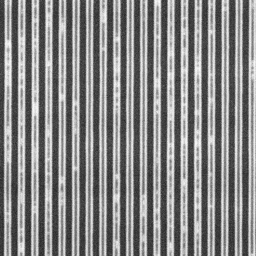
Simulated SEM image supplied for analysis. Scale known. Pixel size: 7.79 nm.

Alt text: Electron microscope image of parallel lines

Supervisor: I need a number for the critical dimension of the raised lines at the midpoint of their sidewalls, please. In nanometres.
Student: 38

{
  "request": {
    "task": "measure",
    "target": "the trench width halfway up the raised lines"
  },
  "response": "67.1 nanometres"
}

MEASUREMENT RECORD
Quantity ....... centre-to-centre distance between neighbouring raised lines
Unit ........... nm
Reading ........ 106